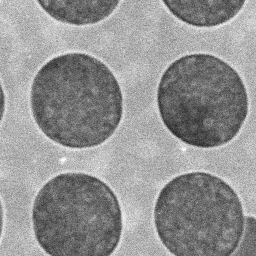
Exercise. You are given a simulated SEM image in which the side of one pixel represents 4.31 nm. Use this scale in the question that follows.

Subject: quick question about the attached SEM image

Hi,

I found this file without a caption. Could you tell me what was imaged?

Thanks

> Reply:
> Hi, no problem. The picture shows holes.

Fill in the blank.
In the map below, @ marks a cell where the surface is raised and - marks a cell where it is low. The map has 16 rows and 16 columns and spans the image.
@@@----@@@-----@
@@@@--@@@@@@--@@
@@@@@@@@@@@@@@@@
@@@@--@@@@@@-@@@
@@-----@@@-----@
@@-----@@@-----@
@@------@@-----@
@@-----@@@-----@
@@@----@@@@----@
@@@@@@@@@@@@@@@@
@@@@@@@@@@@@@@@@
@@@----@@@----@@
@@-----@@@-----@
@@------@@------
@@------@@------
@@@----@@@------